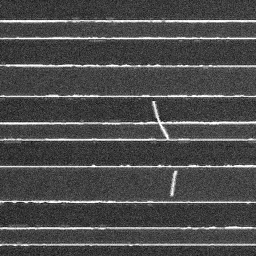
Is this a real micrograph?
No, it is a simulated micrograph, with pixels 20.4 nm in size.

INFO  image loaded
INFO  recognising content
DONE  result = lines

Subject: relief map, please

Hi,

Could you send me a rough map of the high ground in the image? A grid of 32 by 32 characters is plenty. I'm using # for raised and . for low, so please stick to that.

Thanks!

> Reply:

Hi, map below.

................................
................................
................................
################################
################################
................................
................................
................................
################################
################################
################################
################################
................................
................................
................................
################################
################################
................................
................................
................................
................................
################################
################################
################################
################################
................................
................................
................................
.............................#..
################################
################################
................................